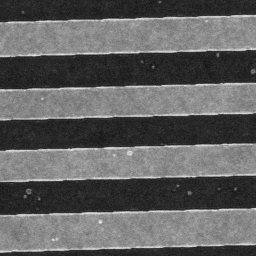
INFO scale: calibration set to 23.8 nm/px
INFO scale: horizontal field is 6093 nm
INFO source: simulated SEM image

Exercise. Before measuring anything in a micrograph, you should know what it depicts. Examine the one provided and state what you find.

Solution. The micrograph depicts lines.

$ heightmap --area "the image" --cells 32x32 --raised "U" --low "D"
DDDDDDDDDDDDDDDDDDDDDDDDDDDDDDDD
DDDDDDDDDDDDDDDDDDDDDDDDDDDDDDDD
DDDDDDDDDDDDDUUUUUUUUUUUUUUUUUUU
UUUUUUUUUUUUUUUUUUUUUUUUUUUUUUUU
UUUUUUUUUUUUUUUUUUUUUUUUUUUUUUUU
UUUUUUUUUUUUUUUUUUUUUUUUUUUUUUUU
UUUUUUUUUUUUUUUUUDDDDDDDDDDDDDDD
DDDDDDDDDDDDDDDDDDDDDDDDDDDDDDDD
DDDDDDDDDDDDDDDDDDDDDDDDDDDDDDDD
DDDDDDDDDDDDDDDDDDDDDDDDDDDDDDDD
DDDDDDDDDDDDDDDDDDDDDDDDDDDDDUUU
UUUUUUUUUUUUUUUUUUUUUUUUUUUUUUUU
UUUUUUUUUUUUUUUUUUUUUUUUUUUUUUUU
UUUUUUUUUUUUUUUUUUUUUUUUUUUUUUUU
UUUUUUUUUUUUUUUUUUDDDDDDDDDDDDDD
DDDDDDDDDDDDDDDDDDDDDDDDDDDDDDDD
DDDDDDDDDDDDDDDDDDDDDDDDDDDDDDDD
DDDDDDDDDDDDDDDDDDDDDDDDDDDDDDDD
DDDDDDDDDDDDDUUUUUUUUUUUUUUUUUUU
UUUUUUUUUUUUUUUUUUUUUUUUUUUUUUUU
UUUUUUUUUUUUUUUUUUUUUUUUUUUUUUUU
UUUUUUUUUUUUUUUUUUUUUUUUUUUUUUUU
UUUUUUUUDDDDDDDDDDDDDDDDDDDDDDDD
DDDDDDDDDDDDDDDDDDDDDDDDDDDDDDDD
DDDDDDDDDDDDDDDDDDDDDDDDDDDDDDDD
DDDDDDDDDDDDDDDDDDDDDDDDDDDDDDDD
DDDDDDDDDDDDDDDDDDDUUUUUUUUUUUUU
UUUUUUUUUUUUUUUUUUUUUUUUUUUUUUUU
UUUUUUUUUUUUUUUUUUUUUUUUUUUUUUUU
UUUUUUUUUUUUUUUUUUUUUUUUUUUUUUUU
UUUUUUUUUUUUUUUUUUUUUUUUUUUUUUUU
DDDDDDDDDDDDDDDDDDDDDDDDDDDDDDDD